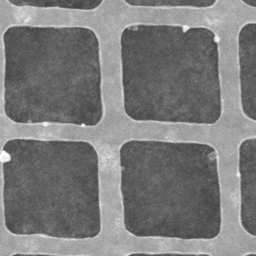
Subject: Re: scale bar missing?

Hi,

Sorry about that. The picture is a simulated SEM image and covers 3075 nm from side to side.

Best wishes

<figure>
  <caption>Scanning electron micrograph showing holes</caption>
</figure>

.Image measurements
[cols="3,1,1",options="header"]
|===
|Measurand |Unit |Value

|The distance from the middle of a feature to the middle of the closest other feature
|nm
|1370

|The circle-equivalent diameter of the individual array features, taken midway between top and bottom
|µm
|1.3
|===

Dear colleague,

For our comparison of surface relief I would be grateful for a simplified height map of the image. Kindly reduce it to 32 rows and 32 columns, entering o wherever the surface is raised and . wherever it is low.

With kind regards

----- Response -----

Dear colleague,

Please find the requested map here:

oo...........ooo...........oooo.
oooooooooooooooooooooooooooooooo
oooooooooooooooooooooooooooooooo
o..........ooooo.......o..oooo..
............ooo............ooo..
o...........ooo............ooo..
o...........ooo............ooo..
o...........ooo............ooo..
o............oo............ooo..
o............oo............ooo..
.............oo............ooo..
.............oo.............oo..
.............oo.............oo..
.............ooo............oo..
o............ooo...........oooo.
oooooooo....oooooooooooooooooooo
oooooooooooooooooooooooooooooooo
o...oo..ooooooooo.ooooooooooooo.
o...........ooo............ooo..
o...........ooo............ooo..
o...........ooo............ooo..
............ooo............ooo..
............ooo............ooo..
.............oo............ooo..
............ooo.............oo..
............ooo.............oo..
.............oo.............oo..
o............oo.............oo..
o............ooo............oo..
oooooo......ooooo..........ooooo
oooooooooooooooooooooooooooooooo
oooooooooooooooooooooooooooooooo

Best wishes